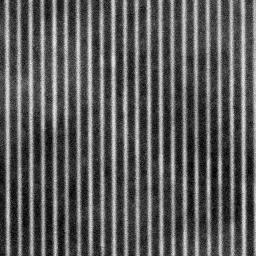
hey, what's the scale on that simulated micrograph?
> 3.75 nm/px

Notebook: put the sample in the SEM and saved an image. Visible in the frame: parallel lines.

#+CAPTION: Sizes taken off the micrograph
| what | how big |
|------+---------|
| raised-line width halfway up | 8.9 nm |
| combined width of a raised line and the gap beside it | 11.8 pixels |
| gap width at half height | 9.63 px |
